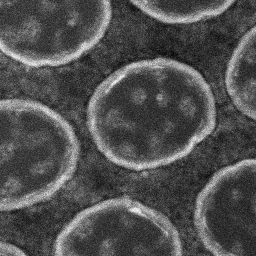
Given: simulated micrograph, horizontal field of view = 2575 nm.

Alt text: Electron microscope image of raised bodies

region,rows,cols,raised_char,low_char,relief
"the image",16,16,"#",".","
#######..#####..
#######.........
######.........#
.####..........#
........####..##
......#######.##
......#######..#
####..#######...
####..#######...
#####..#####....
####...........#
####.........###
##...........###
.....#####..####
....#######..###
....#######..###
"